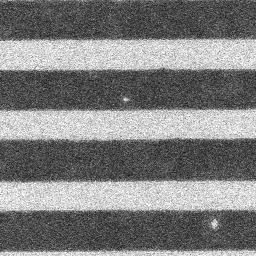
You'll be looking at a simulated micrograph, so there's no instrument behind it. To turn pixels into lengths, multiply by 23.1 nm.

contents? one or a few lines or trenches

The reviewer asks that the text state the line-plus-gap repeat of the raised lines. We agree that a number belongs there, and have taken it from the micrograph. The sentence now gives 70.4 pixels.